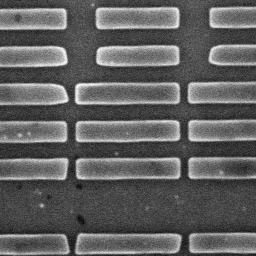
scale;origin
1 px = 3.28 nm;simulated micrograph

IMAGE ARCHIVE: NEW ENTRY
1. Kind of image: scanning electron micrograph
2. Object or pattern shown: wiring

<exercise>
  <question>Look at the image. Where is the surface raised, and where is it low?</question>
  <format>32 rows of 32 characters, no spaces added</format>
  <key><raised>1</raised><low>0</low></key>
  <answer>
00000000000000000000000000000000
11111111000011111111110000111111
11111111000011111111110000111111
11111111000011100000000000000000
00000000000000000000000000000000
00000000000000000000000000000000
11111111000011111111110000111111
11111111000011111111110000111111
00000000000000000000000000000000
00000000000000000000000000000000
00000000000011111111110011111111
11111111001111111111110011111111
11111111011111111111110011111111
00000000000000000000000000000000
00000000000000000000000000000000
11111111001111111111110011111111
11111111001111111111110011111111
11111111001111111111110011111100
00000000000000000000000000000000
00000000000000000000000000000000
11111111001111111111110011111111
11111111001111111110110011111111
00000000000000000000000000000000
00000000000000000000000000000000
00000000000000000000000000000000
00000000000000000000000000000000
00000000000000000000000000000000
00000000000000000000000000000000
00000000000000000000000000000000
11111111001111111111110011111111
11111111001111111111111011111111
11111111001111111111110011111111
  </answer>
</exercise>